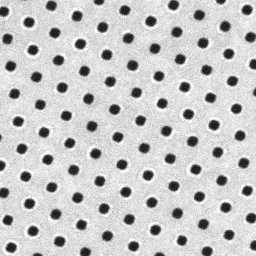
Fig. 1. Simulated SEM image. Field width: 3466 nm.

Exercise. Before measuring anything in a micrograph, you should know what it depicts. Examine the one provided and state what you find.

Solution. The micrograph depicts a regular array of holes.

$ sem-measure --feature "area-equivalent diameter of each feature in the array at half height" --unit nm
150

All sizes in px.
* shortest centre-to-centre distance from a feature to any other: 27.4